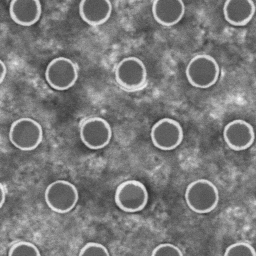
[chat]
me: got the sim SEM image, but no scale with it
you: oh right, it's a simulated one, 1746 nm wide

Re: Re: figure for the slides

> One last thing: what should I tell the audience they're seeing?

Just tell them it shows a regular array of raised bodies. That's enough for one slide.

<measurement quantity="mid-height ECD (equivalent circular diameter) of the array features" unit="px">30.1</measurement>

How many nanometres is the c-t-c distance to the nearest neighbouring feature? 479